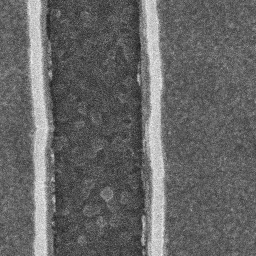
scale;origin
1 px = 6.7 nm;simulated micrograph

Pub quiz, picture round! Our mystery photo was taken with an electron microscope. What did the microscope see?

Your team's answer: one or a few lines or trenches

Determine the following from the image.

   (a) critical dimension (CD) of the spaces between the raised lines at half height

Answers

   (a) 776 nm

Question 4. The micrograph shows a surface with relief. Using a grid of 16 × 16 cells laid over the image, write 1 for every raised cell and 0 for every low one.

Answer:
1100000001111111
1100000001111111
1100000001111111
1100000000111111
1100000000111111
1100000000111111
1110000000111111
1110000000111111
1110000000111111
1110000000111111
1110000000111111
1110000000111111
1110000000111111
1110000000111111
1110000000111111
1110000000111111